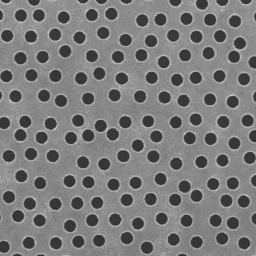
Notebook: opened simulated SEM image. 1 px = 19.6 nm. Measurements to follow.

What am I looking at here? a regular array of holes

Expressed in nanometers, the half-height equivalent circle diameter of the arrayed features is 242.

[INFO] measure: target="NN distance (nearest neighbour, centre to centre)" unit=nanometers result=380